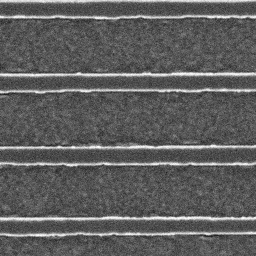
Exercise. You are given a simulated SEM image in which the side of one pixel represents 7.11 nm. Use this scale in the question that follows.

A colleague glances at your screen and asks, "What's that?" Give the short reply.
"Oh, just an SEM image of lines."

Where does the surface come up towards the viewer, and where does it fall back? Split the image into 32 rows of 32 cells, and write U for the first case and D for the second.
UUUUUUUUUUUUUUUUUUUUUUUUUUUUUUUU
UUUUUUUUUUUUUUUUUUUUUUUUUUUUUUUU
DDDDDDDDDDDDDDDDDDDDDDDDDDDDDDDD
DDDDDDDDDDDDDDDDDDDDDDDDDDDDDDDD
DDDDDDDDDDDDDDDDDDDDDDDDDDDDDDDD
DDDDDDDDDDDDDDDDDDDDDDDDDDDDDDDD
DDDDDDDDDDDDDDDDDDDDDDDDDDDDDDDD
DDDDDDDDDDDDDDDDDDDDDDDDDDDDDDDD
DDDDDDDDDDDDDDDDDDDDDDDDDDDDDDDD
UUUUUUUUUUUUUUUUUUUUUUUUUUUUUUUU
UUUUUUUUUUUUUUUUUUUUUUUUUUUUUUUU
UDDDUUDDDDDDDDDDDDDDDDDDDDDDDDDD
DDDDDDDDDDDDDDDDDDDDDDDDDDDDDDDD
DDDDDDDDDDDDDDDDDDDDDDDDDDDDDDDD
DDDDDDDDDDDDDDDDDDDDDDDDDDDDDDDD
DDDDDDDDDDDDDDDDDDDDDDDDDDDDDDDD
DDDDDDDDDDDDDDDDDDDDDDDDDDDDDDDD
DDDDDDDDDDDDDDDDDDDDDDDDDDDDDDDD
UUUUUUUUUUUUUUUUUUUUUUUUUUUUUUUU
UUUUUUUUUUUUUUUUUUUUUUUUUUUUUUUU
DUUUUUUUUUUUUUUUUUUUUUUUUUUUUUUU
DDDDDDDDDDDDDDDDDDDDDDDDDDDDDDDD
DDDDDDDDDDDDDDDDDDDDDDDDDDDDDDDD
DDDDDDDDDDDDDDDDDDDDDDDDDDDDDDDD
DDDDDDDDDDDDDDDDDDDDDDDDDDDDDDDD
DDDDDDDDDDDDDDDDDDDDDDDDDDDDDDDD
DDDDDDDDDDDDDDDDDDDDDDDDDDDDDDDD
UUUUUUUUUUUUUUUUUUUUUUUUUUUUUUUU
UUUUUUUUUUUUUUUUUUUUUUUUUUUUUUUU
DDDDDDDDDDDDDDDDDDDDDDDDDDDDDDDD
DDDDDDDDDDDDDDDDDDDDDDDDDDDDDDDD
DDDDDDDDDDDDDDDDDDDDDDDDDDDDDDDD